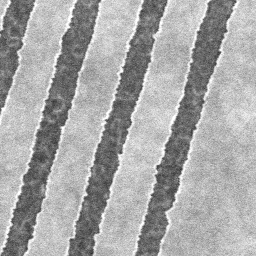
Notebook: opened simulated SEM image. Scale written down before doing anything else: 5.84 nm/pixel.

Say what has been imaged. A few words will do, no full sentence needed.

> one or a few lines or trenches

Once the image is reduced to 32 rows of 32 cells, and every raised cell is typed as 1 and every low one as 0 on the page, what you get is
10001111100011111100011111000011
10001111100011111000011111000111
00001111100011111000111110000111
00011111000011111000111110001111
00011111000011111001111110001111
00011111000111110001111100001111
00111110000111110001111100001111
00111110000111110001111100011111
00111110001111100001111100011111
00111110001111100011111000011111
00111100001111100011111000111111
01111100011111000011111000111111
01111100011111000111111000111111
11111000011111000111110001111111
11111000011110000111110001111111
11111000111110001111100001111111
11110000111110001111100011111111
11110000111100001111100011111111
11110001111100011111000011111111
11110001111100011111000011111111
11110001111000011111000111111111
11100011111000011111000111111111
11100011111000111110000111111111
11100111111000111110001111111111
11000011111000111110001111111111
11000111110001111110001111111111
11000111110001111100011111111111
10000111110001111100011111111111
10001111100011111100011111111111
10001111100011111000011111111111
10001111100011111000111111111111
00011111000011111000111111111111